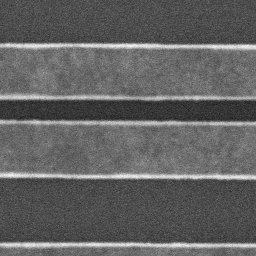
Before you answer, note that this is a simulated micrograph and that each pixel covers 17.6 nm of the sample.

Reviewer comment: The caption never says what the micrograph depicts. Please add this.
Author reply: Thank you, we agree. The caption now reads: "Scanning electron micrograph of lines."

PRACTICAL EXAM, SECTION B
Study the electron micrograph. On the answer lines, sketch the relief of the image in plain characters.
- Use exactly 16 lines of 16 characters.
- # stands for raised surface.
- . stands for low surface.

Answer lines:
................
................
................
################
################
################
................
................
################
################
################
................
................
................
................
################